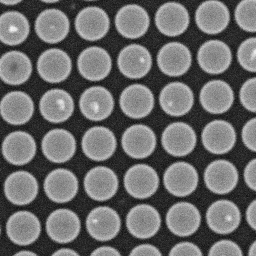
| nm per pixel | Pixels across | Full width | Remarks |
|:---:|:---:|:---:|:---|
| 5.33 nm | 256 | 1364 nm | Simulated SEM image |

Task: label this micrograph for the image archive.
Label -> an array of small figures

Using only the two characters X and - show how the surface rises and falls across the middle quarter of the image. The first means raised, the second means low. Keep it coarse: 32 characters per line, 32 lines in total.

XX--XXXXXXXX--XXXXXXXX--XXXXXXX-
XX--XXXXXXX---XXXXXXX---XXXXXXX-
X---XXXXXXX----XXXXX------XXXX--
------XXXX----------------------
--------------------------------
-----------------XXX------XXXXX-
------XXXXX----XXXXXX----XXXXXXX
X----XXXXXX---XXXXXXXX--XXXXXXXX
XX--XXXXXXXX--XXXXXXXX--XXXXXXXX
XX--XXXXXXXX--XXXXXXXX--XXXXXXXX
XX--XXXXXXXX--XXXXXXXX--XXXXXXXX
XX--XXXXXXXX---XXXXXXX---XXXXXX-
XX---XXXXXX----XXXXXX-----XXXX--
X-----XXXX--------X-------------
--------------------------------
-----------------XXX------XXXXX-
------XXXXX-----XXXXXX---XXXXXXX
X----XXXXXXX---XXXXXXX---XXXXXXX
XX---XXXXXXXX--XXXXXXXX--XXXXXXX
XXX--XXXXXXXX--XXXXXXXX--XXXXXXX
XXX--XXXXXXXX--XXXXXXXX--XXXXXXX
XXX--XXXXXXXX--XXXXXXX----XXXXXX
XX---XXXXXXX----XXXXXX-----XXXX-
X------XXXX---------------------
--------------------------------
------------------XXX------XXXXX
X------XXXX-----XXXXXX----XXXXXX
XX----XXXXXXX---XXXXXXX--XXXXXXX
XXX--XXXXXXXX--XXXXXXXX--XXXXXXX
XXX--XXXXXXXX--XXXXXXXXX-XXXXXXX
XXX--XXXXXXXX--XXXXXXXX--XXXXXXX
XXX--XXXXXXXX---XXXXXXX---XXXXXX